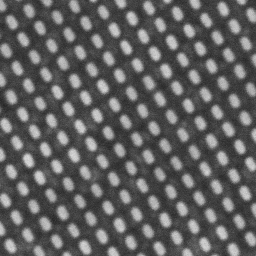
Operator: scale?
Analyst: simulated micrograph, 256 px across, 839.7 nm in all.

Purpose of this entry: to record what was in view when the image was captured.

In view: a regular array of raised bodies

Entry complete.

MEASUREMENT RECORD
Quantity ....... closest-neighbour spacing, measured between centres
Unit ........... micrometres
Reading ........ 0.0665